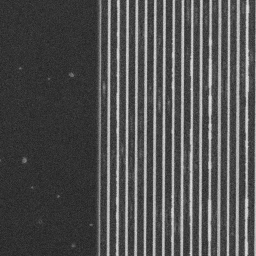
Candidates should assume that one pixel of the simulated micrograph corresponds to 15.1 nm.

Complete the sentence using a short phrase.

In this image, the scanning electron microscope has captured parallel lines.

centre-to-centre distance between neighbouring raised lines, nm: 139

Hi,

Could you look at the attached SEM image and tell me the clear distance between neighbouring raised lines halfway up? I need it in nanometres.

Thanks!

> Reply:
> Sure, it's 106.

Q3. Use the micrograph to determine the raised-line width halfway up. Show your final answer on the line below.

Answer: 26.4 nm